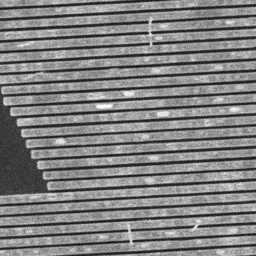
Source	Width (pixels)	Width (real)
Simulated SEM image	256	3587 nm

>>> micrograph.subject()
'parallel lines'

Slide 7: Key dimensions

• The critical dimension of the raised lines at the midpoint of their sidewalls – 110 nanometers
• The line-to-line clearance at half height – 36.7 nm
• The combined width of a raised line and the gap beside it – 10.9 px